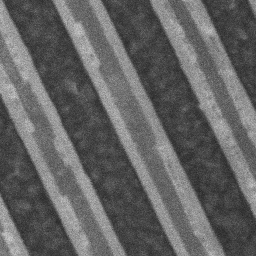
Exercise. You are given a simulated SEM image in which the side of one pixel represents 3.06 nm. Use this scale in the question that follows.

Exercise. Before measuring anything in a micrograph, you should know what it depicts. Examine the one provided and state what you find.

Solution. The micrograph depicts one or a few lines or trenches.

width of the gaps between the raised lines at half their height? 0.169 µm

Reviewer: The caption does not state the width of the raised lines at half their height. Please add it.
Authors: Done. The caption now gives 101 nm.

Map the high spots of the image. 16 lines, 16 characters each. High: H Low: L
LLLLHHLLLLHHLLLL
LLLLHHHLLLLHHLLL
HLLLLHHLLLLHHHLL
HLLLLHHHLLLLHHLL
HHLLLLHHLLLLHHLL
HHLLLLHHHLLLHHHL
LHHLLLLHHLLLLHHL
LHHLLLLHHHLLLHHH
LLHHLLLLHHLLLLHH
LLHHLLLLHHHLLLHH
LLLHHLLLLHHLLLLH
LLLHHLLLLHHLLLLH
LLLLHHLLLLHHLLLL
LLLLHHLLLLHHLLLL
HLLLLHHLLLLHHLLL
HLLLLHHLLLLHHLLL